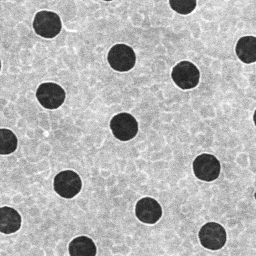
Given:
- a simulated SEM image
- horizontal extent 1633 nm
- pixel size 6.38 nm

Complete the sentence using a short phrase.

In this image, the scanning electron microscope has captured a regular array of holes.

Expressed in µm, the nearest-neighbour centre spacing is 0.44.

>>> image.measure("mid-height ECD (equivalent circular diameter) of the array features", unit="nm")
188